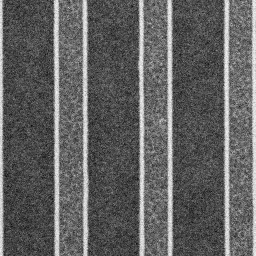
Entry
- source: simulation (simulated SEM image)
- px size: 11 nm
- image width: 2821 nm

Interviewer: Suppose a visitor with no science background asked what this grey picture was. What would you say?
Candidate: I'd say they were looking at one or a few lines or trenches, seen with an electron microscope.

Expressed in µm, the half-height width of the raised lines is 0.313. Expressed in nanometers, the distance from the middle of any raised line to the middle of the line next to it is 935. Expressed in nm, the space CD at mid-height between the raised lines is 623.